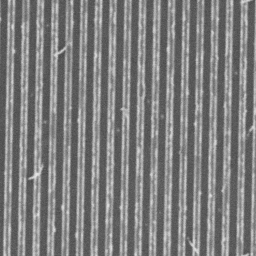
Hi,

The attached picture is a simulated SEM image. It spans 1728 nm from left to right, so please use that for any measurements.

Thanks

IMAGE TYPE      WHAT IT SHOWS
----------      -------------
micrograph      parallel lines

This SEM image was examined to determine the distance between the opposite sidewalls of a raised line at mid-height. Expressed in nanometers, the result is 44.7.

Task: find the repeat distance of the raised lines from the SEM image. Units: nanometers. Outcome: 98.2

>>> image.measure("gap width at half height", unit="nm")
52.3